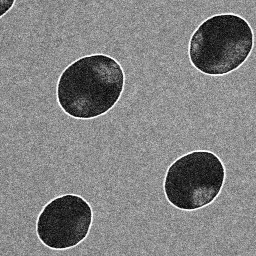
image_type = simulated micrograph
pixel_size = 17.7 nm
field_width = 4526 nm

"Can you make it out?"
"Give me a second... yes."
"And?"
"holes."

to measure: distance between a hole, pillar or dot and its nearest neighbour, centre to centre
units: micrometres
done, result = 2.42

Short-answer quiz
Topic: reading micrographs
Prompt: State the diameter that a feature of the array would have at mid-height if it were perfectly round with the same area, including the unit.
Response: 1060 nm